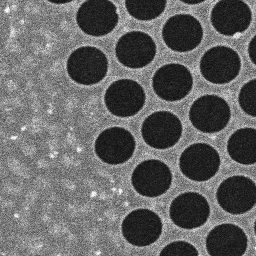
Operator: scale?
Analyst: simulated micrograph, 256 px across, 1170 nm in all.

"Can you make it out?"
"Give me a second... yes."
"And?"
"a regular array of holes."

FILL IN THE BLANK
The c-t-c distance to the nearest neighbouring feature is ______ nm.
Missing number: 224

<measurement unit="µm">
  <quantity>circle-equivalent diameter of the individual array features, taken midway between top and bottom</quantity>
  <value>0.181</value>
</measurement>